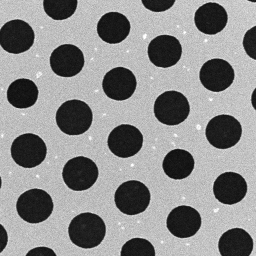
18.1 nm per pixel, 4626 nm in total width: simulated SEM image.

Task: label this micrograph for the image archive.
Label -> a regular array of holes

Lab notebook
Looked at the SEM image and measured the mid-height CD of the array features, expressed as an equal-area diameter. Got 619 nanometres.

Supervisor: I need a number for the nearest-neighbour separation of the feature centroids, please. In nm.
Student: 1010